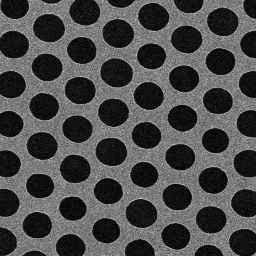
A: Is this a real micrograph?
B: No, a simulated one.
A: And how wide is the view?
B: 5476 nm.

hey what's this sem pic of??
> a regular array of holes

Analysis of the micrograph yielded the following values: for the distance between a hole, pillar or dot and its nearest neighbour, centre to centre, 0.837 um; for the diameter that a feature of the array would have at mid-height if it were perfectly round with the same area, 606 nm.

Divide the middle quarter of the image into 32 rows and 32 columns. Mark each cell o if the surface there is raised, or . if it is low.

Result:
ooooooooo........oo.....ooooo..o
ooooooooo........oooooooooo.....
ooooooooo........ooooooooo......
oo...oooo........ooooooooo......
o......ooo.......oooo.oooo......
........ooo....oooo.....ooo.....
........oooooooooo.......ooo....
........ooooooooo........ooooooo
o......oooooooooo........ooooooo
oo....oooo.....ooo.......ooooooo
ooooooooo.......ooo.....oooo...o
ooooooooo.......ooooo.ooooo.....
oooooooo........oooooooooo......
o.....ooo.......oooooooooo......
.......ooo.....ooooo.ooooo......
.......oooo...oooo.....oooo.....
.......oooooooooo.......oooo...o
.......oooooooooo.......oooooooo
o.....ooooo..oooo.......oooooooo
oo...oooo......ooo......oooooooo
oooooooo.......ooo.....oooo....o
oooooooo........oooooooooo......
oooooooo........ooooooooo.......
.....ooo........ooooooooo.......
......ooo......oooo.oooooo......
.......ooooo.oooo.....oooo......
.......oooooooooo......ooooo..oo
......oooooooooo........oooooooo
......ooooooooooo.......oooooooo
o....ooo......ooo......ooooooooo
oooooooo......oooo....oooo....oo
ooooooo........oooooooooo......o